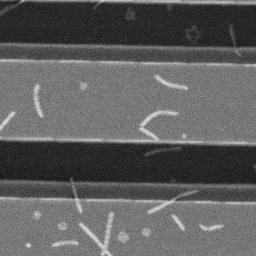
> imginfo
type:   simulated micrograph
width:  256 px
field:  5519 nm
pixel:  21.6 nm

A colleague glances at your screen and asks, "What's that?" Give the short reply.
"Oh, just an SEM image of lines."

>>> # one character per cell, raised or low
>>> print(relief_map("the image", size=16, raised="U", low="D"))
DDDDDDDDDDDDDDDD
DDDDDDDDDDDDDDDD
DDDDDDDDDDDDDDDD
DDDDDDDDDDDDDDDD
UUUUUUUUUUUUUUUU
UUUUUUUUUUUUUUUU
UUUUUUUUUUUUUUUU
UUUUUUUUUUUUUUUU
UUUUUUUUUUUUUUUU
DDDDDDDDDDDDDDDD
DDDDDDDDDDDDDDDD
DDDDDDDDDDDDDDDD
UUUUUUUUUDUUDDDD
UUUUUUUUUUUUUUUU
UUUUUUUUUUUUUUUU
UUUUUUUUUUUUUUUU